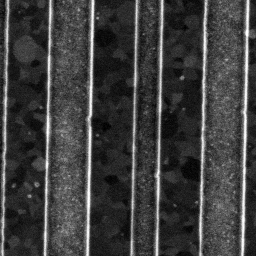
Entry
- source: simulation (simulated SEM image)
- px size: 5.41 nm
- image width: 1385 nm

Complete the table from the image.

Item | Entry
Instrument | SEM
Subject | one or a few lines or trenches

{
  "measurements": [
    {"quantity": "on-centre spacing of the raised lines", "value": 418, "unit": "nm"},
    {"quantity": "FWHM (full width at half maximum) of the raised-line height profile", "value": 232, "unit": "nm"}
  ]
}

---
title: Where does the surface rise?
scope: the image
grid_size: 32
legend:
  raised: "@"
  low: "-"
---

-@@@@@------@@@@@---@@@@@@-----@
-@@@@@------@@@@@---@@@@@@-----@
-@@@@@------@@@@@---@@@@@@-----@
-@@@@@------@@@@@---@@@@@@-----@
-@@@@@------@@@@@---@@@@@@-----@
-@@@@@------@@@@@---@@@@@------@
-@@@@@-----@@@@@@---@@@@@@-----@
-@@@@@-----@@@@@@---@@@@@@-----@
-@@@@@-----@@@@@@---@@@@@------@
-@@@@@-----@@@@@@---@@@@@------@
-@@@@@-----@@@@@@---@@@@@------@
-@@@@@-----@@@@@@---@@@@@------@
-@@@@@-----@@@@@@---@@@@@------@
-@@@@@-----@@@@@@---@@@@@------@
-@@@@@-----@@@@@@---@@@@@------@
-@@@@@-----@@@@@@---@@@@@------@
-@@@@@-----@@@@@@---@@@@@------@
-@@@@@-----@@@@@@---@@@@@------@
-@@@@@-----@@@@@@---@@@@@------@
-@@@@@-----@@@@@@---@@@@@------@
-@@@@@-----@@@@@@---@@@@@------@
-@@@@@-----@@@@@@---@@@@@------@
-@@@@@-----@@@@@@---@@@@@------@
-@@@@@-----@@@@@@---@@@@@------@
-@@@@@-----@@@@@@---@@@@@------@
@@@@@@-----@@@@@@---@@@@@------@
@@@@@@-----@@@@@@---@@@@@-----@@
@@@@@@-----@@@@@@---@@@@@-----@@
@@@@@@-----@@@@@----@@@@@-----@@
@@@@@@-----@@@@@----@@@@@-----@@
@@@@@@-----@@@@@----@@@@@-----@@
@@@@@@-----@@@@@----@@@@@-----@@